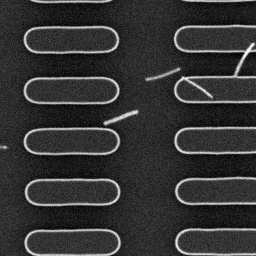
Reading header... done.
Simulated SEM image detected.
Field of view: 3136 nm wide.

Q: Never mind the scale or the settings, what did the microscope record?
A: groups of lines, slits or small figures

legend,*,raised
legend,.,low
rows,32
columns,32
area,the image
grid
................................
................................
................................
.....*********.........*********
...************.......**********
...************.......**********
....*********.................*.
................................
................................
................................
...************.......**********
...************.......**********
....**********.........*********
................................
................................
................................
....**********........**********
...************.......**********
...************.......**********
................................
................................
................................
.........**.*..........*********
...************.......**********
...************.......**********
....**********..........*.......
................................
................................
................................
....***********.......**********
...************.......**********
....**********.........*********